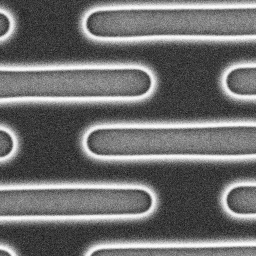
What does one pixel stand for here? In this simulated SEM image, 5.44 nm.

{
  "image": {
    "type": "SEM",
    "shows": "groups of lines, slits or small figures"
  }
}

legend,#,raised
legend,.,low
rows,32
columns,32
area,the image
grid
################################
############....................
.##########.....................
.##########.....................
.###########....................
################################
################################
################################
###########......#############..
...................#########....
...................#########....
..................###########...
################################
################################
################################
################################
.##########.....................
..#########.....................
..#########.....................
.############..................#
################################
################################
################################
##...............############...
...................#########....
...................#########....
..................###########...
################################
################################
################################
################################
.###########....................